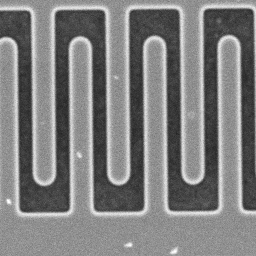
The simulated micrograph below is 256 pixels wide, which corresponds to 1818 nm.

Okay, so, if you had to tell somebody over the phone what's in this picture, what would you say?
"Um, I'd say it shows groups of lines, slits or small figures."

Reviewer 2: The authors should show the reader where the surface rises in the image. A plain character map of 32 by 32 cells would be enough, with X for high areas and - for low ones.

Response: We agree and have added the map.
XXXXXXXXXXXXXXXXXXXXXXXXXXXXXXXX
----XXX------XXX------XXX-------
----XXX------XXX-------XX-------
----XXX------XXX-------XX-------
----XXX------XXX-------XX-------
XX--XXX--XX--XXX--XXX--XX--XXX--
XX--XXX--XX--XXX--XXX--XX--XXX--
XX--XXX--XX--XXX--XXX--XX--XXX--
XX--XXX--XX--XXX--XXX--XX--XXX--
XX--XXX--XX--XXX--XXX--XX--XXX--
XX--XXX--XX--XXX--XXX--XX--XXX--
XX--XXX--XX--XXX--XXX--XX--XXX--
XX--XXX--XXX-XXX--XXX--XX--XXX--
XX--XXX--XXX-XXX--XXX--XX--XXX--
XX--XXX--XXX-XXX--XXX--XX--XXX--
XX--XXX--XXX-XXX--XXX--XX--XXX--
XX--XXX--XXX-XXX--XXX--XX--XXX--
XX--XXX--XXX-XXX--XXX--XX--XXX--
XX--XXX--XXX-XXX--XXX--XX--XXX--
XX--XXX--XXX-XXX--XXX--XX--XXX--
XX--XXX--XXX-XXX--XXX--XX--XXX--
XX--XXX--XXX-XXX--XXX--XXX-XXX--
XX--XXX--XXX--XX--XXX--XX--XXX--
XX-------XXX------XXX------XXX--
XX-------XXX------XXX------XXX--
XX-------XXX------XXX------XXX--
XXX-----XXXX-----XXXXX----XXXXXX
XXXXXXXXXXXXXXXXXXXXXXXXXXXXXXXX
XXXXXXXXXXXXXXXXXXXXXXXXXXXXXXXX
XXXXXXXXXXXXXXXXXXXXXXXXXXXXXXXX
XXXXXXXXXXXXXXXXXXXXXXXXXXXXXXXX
XXXXXXXXXXXXXXXXXXXXXXXXXXXXXXXX